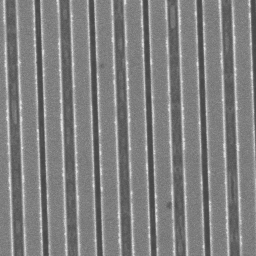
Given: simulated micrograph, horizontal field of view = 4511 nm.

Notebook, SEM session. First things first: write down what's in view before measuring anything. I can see parallel lines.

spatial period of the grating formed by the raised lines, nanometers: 473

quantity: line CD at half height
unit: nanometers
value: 332